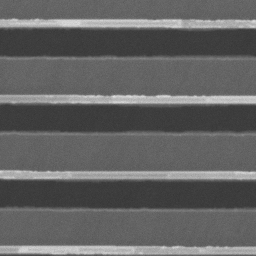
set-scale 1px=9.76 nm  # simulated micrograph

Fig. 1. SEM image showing lines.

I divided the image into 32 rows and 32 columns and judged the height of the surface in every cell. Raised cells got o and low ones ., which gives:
oooooooooooooooooooooooooooooooo
oooooooooooooooooooooooooooooooo
oooooooooooooooooooooooooooooooo
............o....o..ooooooooo...
................................
................................
................................
oooooooooooooooooooooooooooooooo
oooooooooooooooooooooooooooooooo
oooooooooooooooooooooooooooooooo
oooooooooooooooooooooooooooooooo
oooooooooooooooooooooooooooooooo
oooooooooooooooooooooooooooooooo
................................
................................
................................
................................
oooooooooooooooooooooooooooooooo
oooooooooooooooooooooooooooooooo
oooooooooooooooooooooooooooooooo
oooooooooooooooooooooooooooooooo
oooooooooooooooooooooooooooooooo
............................oooo
................................
................................
................................
oooooooooooooooooooooooooooooooo
oooooooooooooooooooooooooooooooo
oooooooooooooooooooooooooooooooo
oooooooooooooooooooooooooooooooo
oooooooooooooooooooooooooooooooo
oooooooooooooooooooooooooooooooo